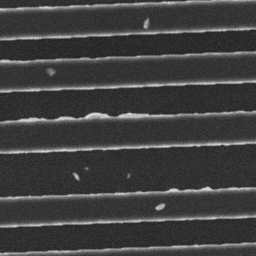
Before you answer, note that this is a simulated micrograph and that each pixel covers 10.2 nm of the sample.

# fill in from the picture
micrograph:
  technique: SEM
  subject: lines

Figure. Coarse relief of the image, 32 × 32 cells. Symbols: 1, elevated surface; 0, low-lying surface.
00000000000000000111111111111111
11111111111111111111111111111111
11111111111111111111111111111111
11111111111111111111111111111111
11111111111000000000000000000000
00000000000000000000000000000000
00000000000000000000000000000000
00000001111111111111111111111111
11111111111111111111111111111111
11111111111111111111111111111111
11111111111111111111111100000000
00000000000000000000000000000000
00000000000000000000000000000000
00000000000000000000000000000000
00000000000110001000111111111111
11111111111111111111111111111111
11111111111111111111111111111111
11111111111111111111111111111111
11111111111111100000000000000000
00000000000000000000000000000000
00000000000000000000000000000000
00000000000000000000000000000000
00000000000000000000000000000000
00000000000000000000000000000000
00000000111111111111111111111111
11111111111111111111111111111111
11111111111111111111111111111111
11111111111111111111100000000000
00000000000000000000000000000000
00000000000000000000000000000000
00000000000000000000000000000011
00000011111111111111111111111111